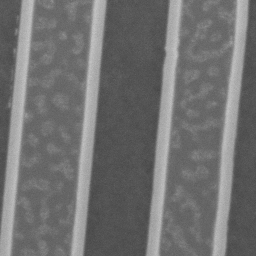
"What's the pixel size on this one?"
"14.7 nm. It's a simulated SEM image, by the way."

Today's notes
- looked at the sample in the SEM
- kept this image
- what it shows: one or a few lines or trenches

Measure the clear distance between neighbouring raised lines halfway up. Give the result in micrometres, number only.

1.1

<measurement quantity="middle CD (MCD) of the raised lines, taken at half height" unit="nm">1020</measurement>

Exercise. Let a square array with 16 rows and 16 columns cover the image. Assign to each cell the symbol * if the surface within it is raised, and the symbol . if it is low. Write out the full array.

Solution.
..****.....****.
..****.....****.
..****.....****.
.*****.....****.
.*****.....****.
.*****.....****.
.*****....*****.
.*****....****..
.*****....****..
.****.....****..
.****.....****..
.****.....****..
.****.....****..
.****.....****..
*****.....****..
*****.....****..